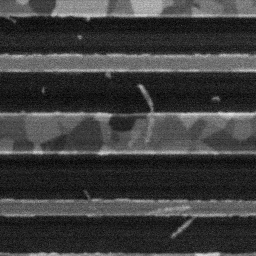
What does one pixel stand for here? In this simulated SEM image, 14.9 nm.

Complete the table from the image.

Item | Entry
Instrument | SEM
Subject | lines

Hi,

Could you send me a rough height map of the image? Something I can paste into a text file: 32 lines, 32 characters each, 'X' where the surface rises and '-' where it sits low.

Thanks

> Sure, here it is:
XXXXXXXXXXXXXXXXXXXXXXXXXXXXXXXX
XXXXXXXXXXXXXXXXXXXXXXXXXXXXXXXX
--------------------------------
--------------------------------
--------------------------------
--------------------------------
--------------------------------
XXXXXXXXXXXXXXXXXXXXXXXXXXXXXXXX
XXXXXXXXXXXXXXXXXXXXXXXXXXXXXXXX
--------------------------------
--------------------------------
--------------------------------
--------------------------------
--------------------------------
XXXXXXXXXXXXXXXXXXXXXXXXXXXXXXXX
XXXXXXXXXXXXXXXXXXXXXXXXXXXXXXXX
XXXXXXXXXXXXXXXXXXXXXXXXXXXXXXXX
XXXXXXXXXXXXXXXXXXXXXXXXXXXXXXXX
XXXXXXXXXXXXXXXXXXXXXXXXXXXXXXXX
--------------------------------
--------------------------------
--------------------------------
--------------------------------
--------------------------------
--------------------------------
XXXXXXXXXXXXXXXXXXXXXXXXXXXXXXXX
XXXXXXXXXXXXXXXXXXXXXXXXXXXXXXXX
--------------------------------
--------------------------------
--------------------------------
--------------------------------
--------------------------------